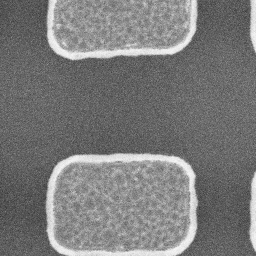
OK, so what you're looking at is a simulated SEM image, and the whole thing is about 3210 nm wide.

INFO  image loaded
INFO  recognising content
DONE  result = raised bodies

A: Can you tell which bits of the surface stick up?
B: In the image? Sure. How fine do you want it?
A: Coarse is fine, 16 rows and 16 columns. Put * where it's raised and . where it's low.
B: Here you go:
...*********....
...*********....
...*********....
................
................
................
................
................
................
................
....********....
...*********....
...*********....
...*********....
...*********....
....*******.....